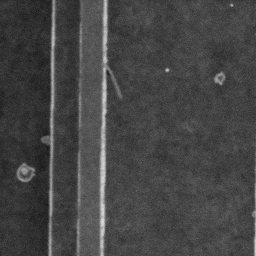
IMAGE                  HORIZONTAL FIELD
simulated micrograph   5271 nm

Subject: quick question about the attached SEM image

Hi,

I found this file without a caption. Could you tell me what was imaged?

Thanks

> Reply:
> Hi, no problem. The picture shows lines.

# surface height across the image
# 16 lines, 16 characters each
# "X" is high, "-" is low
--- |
---XXXX---------
---XXXX---------
---XXXX---------
---XXXX---------
---XXXX---------
---XXXX---------
---XXXX---------
---XXXX---------
---XXXX---------
---XXXX---------
---XXXX---------
---XXX----------
---XXX----------
---XXX----------
---XXX----------
---XXX----------